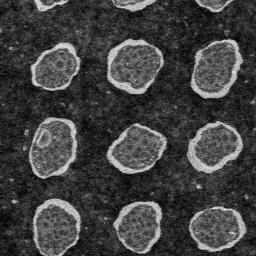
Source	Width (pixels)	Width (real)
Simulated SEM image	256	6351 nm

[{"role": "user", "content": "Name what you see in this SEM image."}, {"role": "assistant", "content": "a regular array of raised bodies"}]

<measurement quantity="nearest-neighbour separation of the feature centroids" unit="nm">1930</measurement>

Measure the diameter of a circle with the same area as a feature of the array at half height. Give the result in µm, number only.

1.18